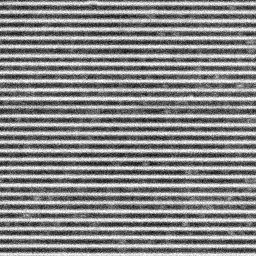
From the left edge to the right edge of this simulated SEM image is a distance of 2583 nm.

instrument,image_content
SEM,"parallel lines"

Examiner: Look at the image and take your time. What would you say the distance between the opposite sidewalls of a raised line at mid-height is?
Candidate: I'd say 0.0202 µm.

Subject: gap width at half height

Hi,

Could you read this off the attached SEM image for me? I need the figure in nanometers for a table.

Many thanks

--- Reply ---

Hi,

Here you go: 66.8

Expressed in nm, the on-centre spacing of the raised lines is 87.5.